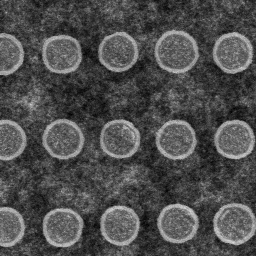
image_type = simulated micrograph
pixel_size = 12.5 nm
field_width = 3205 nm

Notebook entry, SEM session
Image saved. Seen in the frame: a regular array of raised bodies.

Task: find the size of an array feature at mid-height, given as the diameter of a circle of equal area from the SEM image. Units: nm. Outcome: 462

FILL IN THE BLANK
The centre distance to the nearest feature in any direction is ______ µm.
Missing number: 0.709